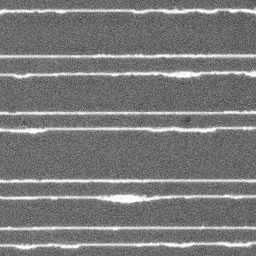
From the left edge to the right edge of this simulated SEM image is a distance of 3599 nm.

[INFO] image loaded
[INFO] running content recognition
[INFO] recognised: lines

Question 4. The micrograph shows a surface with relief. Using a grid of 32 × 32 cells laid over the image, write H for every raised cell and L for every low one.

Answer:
HHHHHHHHHHHHHHHHHHHHHHHHHHHHHHHH
HLLLLLLLLLLLLLLLLHLLLHHLLLHLLLLH
LLLLLLLLLLLLLLLLLLLLLLLLLLLLLLLL
LLLLLLLLLLLLLLLLLLLLLLLLLLLLLLLL
LLLLLLLLLLLLLLLLLLLLLLLLLLLLLLLL
LLLLLLLLLLLLLLLLLLLLLLLLLLLLLLLL
LLLLLLLLLLLLLLLLLLLLLLLLLLLLLLLL
HHHHHHHHHHHHHHHHHHHHHHHHHHHHHHHH
HHHHHHHHHHHHHHHHHHHHHHHHHHHHHHHH
LLHLLLLLLLLLLLLLLLLLLLHHLLLLLLLL
LLLLLLLLLLLLLLLLLLLLLLLLLLLLLLLL
LLLLLLLLLLLLLLLLLLLLLLLLLLLLLLLL
LLLLLLLLLLLLLLLLLLLLLLLLLLLLLLLL
LLLLLLLLLLLLLLLLLLLLLLLLLLLLLLLL
HHHHHHHHHHHHHHHHHHHHHHHHHHHHHHHH
HHHHHHHHHHHHHHHHHHHHHHHHHHHHHHHH
LLLHHLLLLLLLLLLLLLLLLLLLLLLLLLLL
LLLLLLLLLLLLLLLLLLLLLLLLLLLLLLLL
LLLLLLLLLLLLLLLLLLLLLLLLLLLLLLLL
LLLLLLLLLLLLLLLLLLLLLLLLLLLLLLLL
LLLLLLLLLLLLLLLLLLLLLLLLLLLLLLLL
LLLLLLLLLLLLLLLLLLLLLLLLLLLLLLLL
LLLLLLLLLLLLLLLLLLLLLLLLLLLLLLLL
HHHHHHHHHHHHHHHHHHHHHHHHHHHHHHHH
HHHHHHHHHHHHHHHHHHHHHHHHHHHHHHHH
LLLLLLLLLLLLLLLLLLLLLLLLLLLLLLLL
LLLLLLLLLLLLLLLLLLLLLLLLLLLLLLLL
LLLLLLLLLLLLLLLLLLLLLLLLLLLLLLLL
LLLLLHHHHHHHHHHHHHHHHHHHHHHHHHHH
HHHHHHHHHHHHHHHHHHHHHHHHHHHHHHHH
HHHHHHHHHHHHHHHHHHHHLHHHLLLLHHHL
LLLLLLLLLLLLLLLLLLLLLLLLLLLLLLLL